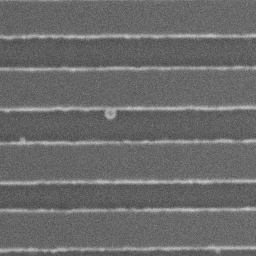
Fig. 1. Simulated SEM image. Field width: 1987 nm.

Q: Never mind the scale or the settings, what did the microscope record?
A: lines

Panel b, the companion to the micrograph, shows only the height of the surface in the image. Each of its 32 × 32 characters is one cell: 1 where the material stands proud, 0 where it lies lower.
11111111111111111111111111111111
11111111111111111111111111111111
11111111111111111111111111111111
11111111111111111111111111111111
11111111111111111111111111111111
00000000000000000000000000000000
00000000000000000000000000000000
00000000000000000000000000000000
00000000000011111111111111111111
11111111111111111111111111111111
11111111111111111111111111111111
11111111111111111111111111111111
11111111111111111111111111111111
11111111111111111111111111111111
00000000000000000000000000000000
00000000000000000000000000000000
00000000000000000000000000000000
00000000000000000000000000000000
11111111111111111111111111111111
11111111111111111111111111111111
11111111111111111111111111111111
11111111111111111111111111111111
11111111111111111111111111111111
00000000000000000000000000000000
00000000000000000000000000000000
00000000000000000000000000000000
11111111111111111111111111111111
11111111111111111111111111111111
11111111111111111111111111111111
11111111111111111111111111111111
11111111111111111111111111111111
00000000000000000000000000000000